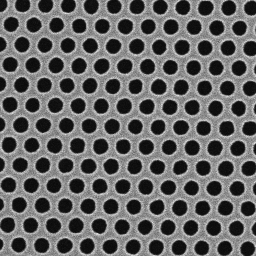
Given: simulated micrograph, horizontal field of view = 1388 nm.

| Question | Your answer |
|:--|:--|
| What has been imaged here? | a regular array of holes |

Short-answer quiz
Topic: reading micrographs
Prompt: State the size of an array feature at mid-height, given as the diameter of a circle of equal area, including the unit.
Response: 82.7 nm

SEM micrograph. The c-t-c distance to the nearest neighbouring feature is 123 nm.